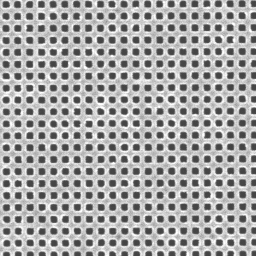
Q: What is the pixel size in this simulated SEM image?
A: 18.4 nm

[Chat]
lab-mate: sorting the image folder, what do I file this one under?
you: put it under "a regular array of holes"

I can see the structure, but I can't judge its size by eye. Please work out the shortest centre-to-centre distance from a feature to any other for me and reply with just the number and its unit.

214 nanometres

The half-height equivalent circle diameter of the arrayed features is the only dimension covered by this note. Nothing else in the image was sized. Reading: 0.144 microns